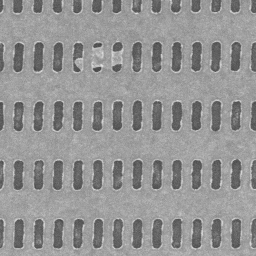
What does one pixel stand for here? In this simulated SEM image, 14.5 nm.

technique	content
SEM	a regular array of holes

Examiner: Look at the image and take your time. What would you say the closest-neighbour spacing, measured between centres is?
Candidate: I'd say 286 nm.